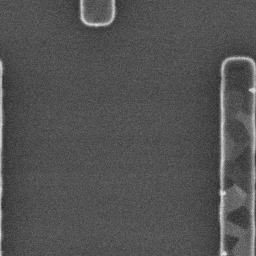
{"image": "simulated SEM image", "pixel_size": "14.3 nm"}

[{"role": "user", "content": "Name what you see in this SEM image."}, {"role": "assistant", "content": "wiring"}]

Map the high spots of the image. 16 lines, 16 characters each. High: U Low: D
DDDDDUUDDDDDDDDD
DDDDDDUDDDDDDDDD
DDDDDDDDDDDDDDDD
DDDDDDDDDDDDDDDD
DDDDDDDDDDDDDDUU
DDDDDDDDDDDDDDUU
DDDDDDDDDDDDDDUU
DDDDDDDDDDDDDDUU
DDDDDDDDDDDDDDUU
DDDDDDDDDDDDDDUU
DDDDDDDDDDDDDDUU
DDDDDDDDDDDDDDUU
DDDDDDDDDDDDDDUU
DDDDDDDDDDDDDDUU
DDDDDDDDDDDDDDUU
DDDDDDDDDDDDDDUU